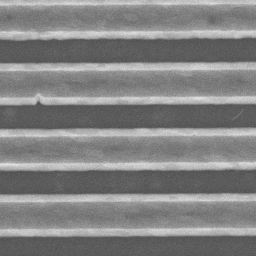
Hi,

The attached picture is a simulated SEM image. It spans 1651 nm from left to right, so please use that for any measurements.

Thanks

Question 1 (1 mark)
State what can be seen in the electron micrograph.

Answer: one or a few lines or trenches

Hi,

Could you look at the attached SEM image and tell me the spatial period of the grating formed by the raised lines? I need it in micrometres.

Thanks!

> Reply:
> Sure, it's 0.423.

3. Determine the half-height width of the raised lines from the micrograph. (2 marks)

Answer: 222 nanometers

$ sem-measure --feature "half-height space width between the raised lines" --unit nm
201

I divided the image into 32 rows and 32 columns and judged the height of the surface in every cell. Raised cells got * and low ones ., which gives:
********************************
********************************
********************************
********************************
..................*.............
................................
................................
................................
********************************
********************************
********************************
********************************
********************.*****.*.***
................................
................................
................................
.........................*.*****
********************************
********************************
********************************
********************************
................................
................................
................................
................................
********************************
********************************
********************************
********************************
................................
................................
................................